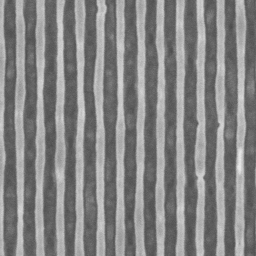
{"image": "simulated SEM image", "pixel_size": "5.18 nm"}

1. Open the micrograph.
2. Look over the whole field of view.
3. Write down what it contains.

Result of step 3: parallel lines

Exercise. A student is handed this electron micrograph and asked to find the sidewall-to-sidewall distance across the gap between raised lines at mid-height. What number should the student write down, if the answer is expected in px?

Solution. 12.5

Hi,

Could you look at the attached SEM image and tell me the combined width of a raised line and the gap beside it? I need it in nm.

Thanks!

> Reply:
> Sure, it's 104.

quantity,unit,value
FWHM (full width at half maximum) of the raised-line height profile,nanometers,37.5